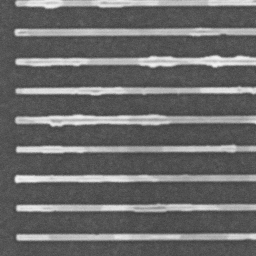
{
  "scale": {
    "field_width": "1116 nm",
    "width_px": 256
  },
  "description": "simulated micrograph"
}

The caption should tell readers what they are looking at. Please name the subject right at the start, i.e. parallel lines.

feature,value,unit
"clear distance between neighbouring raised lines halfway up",102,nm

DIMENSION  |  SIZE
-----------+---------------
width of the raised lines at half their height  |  25.1 nanometers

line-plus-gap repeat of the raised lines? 29.3 pixels